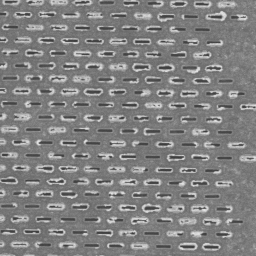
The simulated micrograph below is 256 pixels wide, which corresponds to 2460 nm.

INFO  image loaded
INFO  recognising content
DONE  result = a regular array of holes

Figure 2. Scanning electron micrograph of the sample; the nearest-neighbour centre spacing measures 16.8 px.